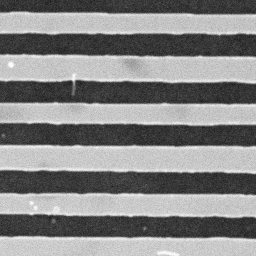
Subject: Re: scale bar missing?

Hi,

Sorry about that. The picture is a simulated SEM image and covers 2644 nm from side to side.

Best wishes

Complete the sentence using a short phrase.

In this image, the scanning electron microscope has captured lines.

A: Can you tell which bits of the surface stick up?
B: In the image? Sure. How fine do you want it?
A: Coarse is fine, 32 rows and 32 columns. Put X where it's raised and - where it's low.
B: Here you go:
--------------------------------
--------------------------------
XXXXXXXXXXXXXXXXXXXXXXXXXXXXXXXX
XXXXXXXXXXXXXXXXXXXXXXXXXXXXXXXX
--------------------------------
--------------------------------
--------------------------------
XXXXXXXXXXXXXXXXXXXXXXXXXXXXXXXX
XXXXXXXXXXXXXXXXXXXXXXXXXXXXXXXX
XXXXXXXXXXXXXXXXXXXXXXXXXXXXXXXX
--------------------------------
--------------------------------
--------------------------------
XXXXXXXXXXXXXXXXXXXXXXXXXXXXXXXX
XXXXXXXXXXXXXXXXXXXXXXXXXXXXXXXX
-----------------------XXXXX----
--------------------------------
--------------------------------
XXXXXXXXXXXXXXXXXXXXXXXXXXXXXXXX
XXXXXXXXXXXXXXXXXXXXXXXXXXXXXXXX
XXXXXXXXXXXXXXXXXXXXXXXXXXXXXXXX
----------------------XXXXX-XXXX
--------------------------------
--------------------------------
XXXXXXXXXXXXXXXXXXXXXXXXXXXXXXXX
XXXXXXXXXXXXXXXXXXXXXXXXXXXXXXXX
XXXXXXXXXXXXXXXXXXXXXXXXXXXXXXXX
--------------------------------
--------------------------------
--------------------------------
XXXXXXXXXXXXXXXXXXXXXXXXXXXXXXXX
XXXXXXXXXXXXXXXXXXXXXXXXXXXXXXXX